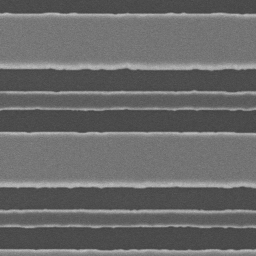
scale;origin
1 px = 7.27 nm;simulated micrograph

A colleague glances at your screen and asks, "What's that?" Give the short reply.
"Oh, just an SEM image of lines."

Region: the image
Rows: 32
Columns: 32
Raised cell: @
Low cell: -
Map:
--------------------------------
--------------------------------
@@@@@@@@@@@@@@@@@@@@@@@@@@@@@@@@
@@@@@@@@@@@@@@@@@@@@@@@@@@@@@@@@
@@@@@@@@@@@@@@@@@@@@@@@@@@@@@@@@
@@@@@@@@@@@@@@@@@@@@@@@@@@@@@@@@
@@@@@@@@@@@@@@@@@@@@@@@@@@@@@@@@
@@@@@@@@@@@@@@@@@@@@@@@@@@@@@@@@
-------@@@@@@@@-@@@@@@@@@@@@@@@-
--------------------------------
--------------------------------
@@@@@@@@@@@@@@@@@@@@@-@@@@@@--@@
@@@@@@@@@@@@@@@@@@@@@@@@@@@@@@@@
@@@@@@@@@@@@@@@@@@@@@@@@@@@@@@@@
--------------------------------
--------------------------------
--------------------------------
@@@@@@@@@@@@@@@@@@@@@@@@@@@@@@@@
@@@@@@@@@@@@@@@@@@@@@@@@@@@@@@@@
@@@@@@@@@@@@@@@@@@@@@@@@@@@@@@@@
@@@@@@@@@@@@@@@@@@@@@@@@@@@@@@@@
@@@@@@@@@@@@@@@@@@@@@@@@@@@@@@@@
@@@@@@@@@@@@@@@@@@@@@@@@@@@@@@@@
--------------------------------
--------------------------------
--------------------------------
@@@@@@@@@@@@@@@@@@@@@@@@@@@@@@@@
@@@@@@@@@@@@@@@@@@@@@@@@@@@@@@@@
--------------------------------
--------------------------------
--------------------------------
@@@@@@@@@@@@@@@@@@@@@@@@@@@@@@@@